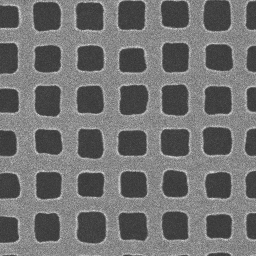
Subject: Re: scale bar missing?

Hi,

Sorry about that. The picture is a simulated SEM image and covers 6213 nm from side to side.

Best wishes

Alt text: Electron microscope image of a regular array of holes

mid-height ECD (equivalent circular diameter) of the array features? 0.74 µm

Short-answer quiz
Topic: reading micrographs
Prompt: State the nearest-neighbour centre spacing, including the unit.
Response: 1000 nm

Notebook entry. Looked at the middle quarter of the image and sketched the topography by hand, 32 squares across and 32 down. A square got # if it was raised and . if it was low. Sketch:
###.......####.......###.......#
####.....#####......#####......#
################################
################################
################################
####.....#####......#####......#
###.......####.......###.......#
###.......####.......###.......#
###.......####.......###.......#
###.......####.......###.......#
###.......####.......###.......#
###.......####.......####......#
#######..#####......#####.....##
################################
################################
################################
####.....######....######......#
###.......####.......###.......#
###.......###........###........
###.......###........###.......#
###.......###........###.......#
###.......###........###.......#
###.......####......#####......#
#####....#######################
################################
################################
##########################.#####
####......####......#####.....##
###.......####.......####......#
###.......####.......####......#
###.......####.......####......#
###.......####.......####......#